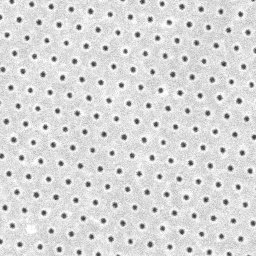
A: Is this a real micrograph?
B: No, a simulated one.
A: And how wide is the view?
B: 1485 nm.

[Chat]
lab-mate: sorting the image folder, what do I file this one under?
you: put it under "a regular array of holes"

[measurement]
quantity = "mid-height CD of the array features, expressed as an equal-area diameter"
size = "38.2 nm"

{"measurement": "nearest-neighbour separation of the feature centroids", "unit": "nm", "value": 112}